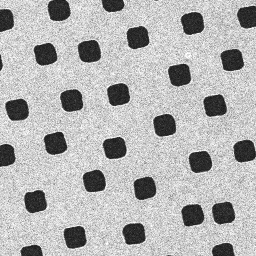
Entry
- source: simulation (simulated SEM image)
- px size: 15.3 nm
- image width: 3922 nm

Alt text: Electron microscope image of a regular array of holes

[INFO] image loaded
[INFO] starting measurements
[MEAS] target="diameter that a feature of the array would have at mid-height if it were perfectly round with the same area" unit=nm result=357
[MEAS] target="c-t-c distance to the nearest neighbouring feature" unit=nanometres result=718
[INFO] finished